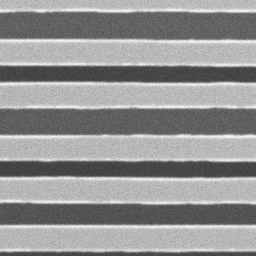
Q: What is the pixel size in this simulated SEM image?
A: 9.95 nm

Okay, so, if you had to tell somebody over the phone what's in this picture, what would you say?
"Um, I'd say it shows lines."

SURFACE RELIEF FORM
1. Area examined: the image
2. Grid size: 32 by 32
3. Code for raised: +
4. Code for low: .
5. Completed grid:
++++++++++++++++++++++++++++++++
................................
................................
................................
................................
++++++++++++++++++++++++++++++++
++++++++++++++++++++++++++++++++
++++++++++++++++++++++++++++++++
................................
................................
++++++++++++++++++++++++++++++++
++++++++++++++++++++++++++++++++
++++++++++++++++++++++++++++++++
.........++++...................
................................
................................
................................
++++++++++++++++++++++++++++++++
++++++++++++++++++++++++++++++++
++++++++++++++++++++++++++++++++
................................
................................
++++++++++++++++++++++++++++++++
++++++++++++++++++++++++++++++++
++++++++++++++++++++++++++++++++
................................
................................
................................
++++++++++++++++++++++++++++++++
++++++++++++++++++++++++++++++++
++++++++++++++++++++++++++++++++
................................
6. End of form